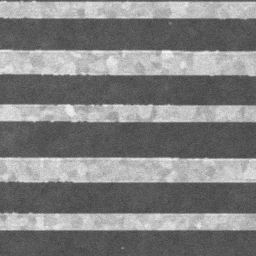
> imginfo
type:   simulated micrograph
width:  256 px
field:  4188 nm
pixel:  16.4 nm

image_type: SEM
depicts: lines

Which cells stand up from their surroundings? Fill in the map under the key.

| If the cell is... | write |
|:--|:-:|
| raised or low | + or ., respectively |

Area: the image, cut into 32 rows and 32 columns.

++++++++++++++++++++++++++++++++
++++++++++++++++++++++++++++++++
................................
................................
................................
................................
++..+++.+.......................
++++++++++++++++++++++++++++++++
++++++++++++++++++++++++++++++++
................................
................................
................................
................................
++++++++++++++++++++++++++++++++
++++++++++++++++++++++++++++++++
................................
................................
................................
................................
................................
++++++++++++++++++++++++++++++++
++++++++++++++++++++++++++++++++
++++++++++++++++++++++++++++++++
................................
................................
................................
................................
++++++++++++++++++++++++++++++++
++++++++++++++++++++++++++++++++
................................
................................
................................